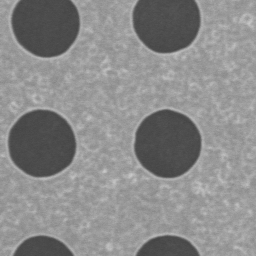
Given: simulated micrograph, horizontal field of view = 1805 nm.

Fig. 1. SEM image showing holes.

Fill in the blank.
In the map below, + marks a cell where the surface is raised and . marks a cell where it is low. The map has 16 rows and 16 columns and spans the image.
+....+++....++++
+....+++.....+++
+....++++...++++
++..++++++++++++
++++++++++++++++
++++++++++++++++
++++++++++++++++
+...+++++...++++
+....+++.....+++
+....+++.....+++
+...+++++...++++
++++++++++++++++
++++++++++++++++
++++++++++++++++
++++++++++++++++
+...+++++...++++